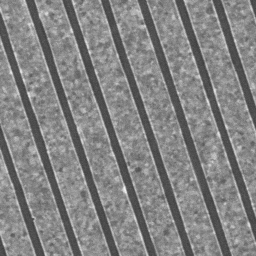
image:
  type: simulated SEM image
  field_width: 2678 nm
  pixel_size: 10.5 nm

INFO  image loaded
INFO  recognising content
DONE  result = parallel lines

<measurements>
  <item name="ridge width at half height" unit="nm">272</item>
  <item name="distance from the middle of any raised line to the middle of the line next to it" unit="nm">370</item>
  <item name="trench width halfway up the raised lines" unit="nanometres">100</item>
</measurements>